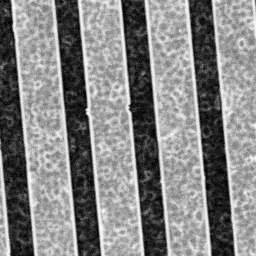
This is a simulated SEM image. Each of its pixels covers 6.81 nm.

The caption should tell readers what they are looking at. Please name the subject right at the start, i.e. one or a few lines or trenches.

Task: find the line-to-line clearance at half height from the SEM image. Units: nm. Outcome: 177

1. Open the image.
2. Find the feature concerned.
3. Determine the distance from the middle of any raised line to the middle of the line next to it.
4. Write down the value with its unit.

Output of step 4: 453 nanometres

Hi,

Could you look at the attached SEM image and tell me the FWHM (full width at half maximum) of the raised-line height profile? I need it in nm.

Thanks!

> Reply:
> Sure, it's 277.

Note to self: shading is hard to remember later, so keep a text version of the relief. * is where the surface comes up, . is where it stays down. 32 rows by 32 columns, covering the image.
..*****...*****...*****....*****
..*****...*****...*****....*****
..*****...*****....*****...*****
..*****...*****....*****...*****
..*****...*****....*****...*****
..*****...*****....*****...*****
..*****...******...*****...*****
..*****....*****...*****...*****
..*****....*****...*****...*****
..******...*****...*****...*****
..******...*****...*****....****
...*****...*****...*****....****
...*****...*****...******...****
...*****...*****....*****...****
...*****...*****....*****...****
...*****...*****....*****...****
...*****...*****....*****...****
...*****....*****...*****...****
...*****....*****...*****...****
...*****....*****...*****...****
...******...*****...*****...****
...******...*****...*****....***
....*****...*****...*****....***
....*****...*****...******...***
*...*****...*****....*****...***
*...*****...*****....*****...***
*...*****...*****....*****...***
*...*****...*****....*****...***
*...*****....*****...*****...***
*...*****....*****...*****...***
*...*****....*****...*****...***
*...******...*****...*****...***